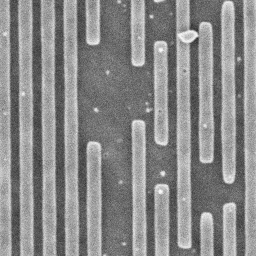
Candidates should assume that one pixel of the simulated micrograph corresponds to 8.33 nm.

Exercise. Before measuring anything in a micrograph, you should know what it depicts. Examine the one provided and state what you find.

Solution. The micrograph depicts wiring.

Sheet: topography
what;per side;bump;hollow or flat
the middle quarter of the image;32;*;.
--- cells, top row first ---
***....................***..***.
***....................***..***.
***....................***..***.
***....................***..***.
***....................***..***.
***....................***..***.
***....................***..***.
***....................***..***.
***....................***..***.
***....................***..***.
***....................***..***.
***....................***..***.
***....................***..***.
***....................***..***.
***..............***...***..***.
***..............***...***..****
***..............***...***..****
***..............***...***..****
***..............***...***..****
***..............***...***..****
***...***........***........****
***...***........***........****
***...***........***........****
***...***........***........***.
***...***........***........***.
***...***........***.........**.
***...***........***.........**.
***...***........***....*....**.
***...***........***.........**.
.**...***........***.........**.
.**...***........***...***..****
.**...***........***...***..****